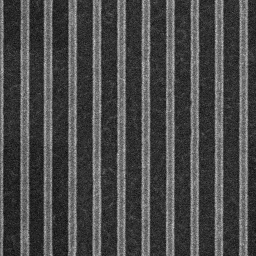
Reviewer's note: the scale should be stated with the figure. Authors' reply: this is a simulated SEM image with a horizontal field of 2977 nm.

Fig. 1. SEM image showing parallel lines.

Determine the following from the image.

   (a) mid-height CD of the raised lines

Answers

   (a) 74.1 nm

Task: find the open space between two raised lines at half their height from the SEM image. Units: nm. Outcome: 212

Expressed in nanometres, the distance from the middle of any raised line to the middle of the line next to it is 282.